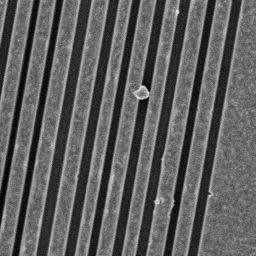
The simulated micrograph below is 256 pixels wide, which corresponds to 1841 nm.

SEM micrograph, parallel lines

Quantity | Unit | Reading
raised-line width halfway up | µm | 0.11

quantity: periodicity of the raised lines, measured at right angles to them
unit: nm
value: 177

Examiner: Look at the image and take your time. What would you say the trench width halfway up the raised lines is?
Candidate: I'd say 68.1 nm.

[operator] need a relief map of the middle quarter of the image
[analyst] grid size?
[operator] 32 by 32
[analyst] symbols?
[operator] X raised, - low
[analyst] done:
X---XXXX---XXX--XXXX---XXX---XXX
X---XXXX---XXX--XXXX---XXX---XXX
X---XXXX---XXX--XXXX---XXX---XXX
X---XXXX---XXX--XXXX--XXX---XXXX
----XXXX--XXX---XXX---XXX---XXXX
---XXXX---XXX---XXXX--XXX---XXXX
---XXXX---XXX--XXXXXX-XXX---XXXX
---XXXX---XXX--XXXXXXXXXX---XXXX
---XXXX---XXX--XXXXXXXXXX--XXXXX
---XXXX---XXX--XXXX--XXXX--XXXXX
---XXXX--XXX---XXX---XXX---XXXX-
--XXXX---XXX--XXXX---XXX---XXXX-
--XXXX---XXX--XXXX---XXX---XXXX-
--XXXX---XXX--XXXX---XXX---XXXX-
--XXXX---XXX--XXXX--XXX---XXXXX-
--XXXX--XXX---XXX---XXX---XXXX--
--XXXX--XXX---XXX---XXX---XXXX--
-XXXX---XXX--XXXX---XXX---XXXX--
-XXXX---XXX--XXXX---XXX---XXXX--
-XXXX---XXX--XXXX---XXX---XXXX--
-XXXX---XXX--XXXX--XXX---XXXXX--
-XXX---XXX---XXX---XXX---XXXX--X
-XXX---XXX---XXX---XXX---XXXX--X
XXXX---XXX--XXXX---XXX---XXXX--X
XXXX---XXX--XXXX---XXX--XXXXX--X
XXXX---XXX--XXXX---XXX--XXXXX--X
XXXX---XXX--XXXX--XXXX--XXXXX--X
XXXX--XXX---XXX---XXX---XXXX--XX
XXX---XXX--XXXX---XXX---XXXX--XX
XXX---XXX--XXXX---XXX---XXXX--XX
XXX---XXX--XXXX---XXX---XXXX--XX
XXX---XXX--XXXX--XXXX--XXXX---XX